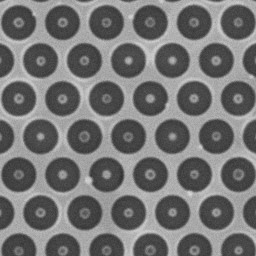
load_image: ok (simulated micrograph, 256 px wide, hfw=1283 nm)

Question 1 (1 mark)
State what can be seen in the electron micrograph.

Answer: an array of small figures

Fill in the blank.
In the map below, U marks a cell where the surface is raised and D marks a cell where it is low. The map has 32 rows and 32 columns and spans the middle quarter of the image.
UDDDDDDDDUUUDDDDDDDDUUUDDDDDDDDU
UDDDDDDDDUUUDDDDDDDDUUUDDDDDDDDU
UUDDDDDDUUUUUDDDDDDUUUUUDDDDDDUU
UUUDDDDUUUUUUUUDDUUUUUUUUUDDUUUU
DDUUUUUUUDDDUUUUUUUUDDDUUUUUUUDD
DDDUUUUDDDDDDDUUUUUDDDDDDUUUUDDD
DDDDUUDDDDDDDDDUUUDDDDDDDDUUUDDD
DDDDUUDDDDDDDDDUUDDDDDDDDDUUDDDD
DDDDUUDDDDUUDDDUUDDDDUDDDDUUDDDD
DDDDUUDDDDUDDDDUUDDDDDDDDDUUDDDD
DDDDUUDDDDDDDDDUUDDDDDDDDDUUUDDD
DDDUUUUDDDDDDDUUUUDDDDDDDUUUUDDD
DDUUUUUUDDDDDUUUUUUDDDDDUUUUUUDD
UUUUUUUUUUDUUUUUUUUUUUUUUUUUUUUU
UUUDDDDDUUUUUDDDDDDUUUUUUDDDDDUU
UUDDDDDDDUUUDDDDDDDDUUUDDDDDDDDU
UDDDDDDDDDUUDDDDDDDDUUUDDDDDDDDU
DDDDUUDDDDUUDDDUUDDDDUDDDDDDDDDD
DDDDUUDDDDUUDDDUUDDDDUDDDDDDDDDD
UDDDDDDDDUUUDDDDDDDDUUUDDDDDDDDU
UDDDDDDDDUUUDDDDDDDDUUUDDDDDDDDU
UUDDDDDDUUUUUDDDDDDUUUUUDDDDDDUU
UUUUDDUUUUUUUUUDDUUUUUUUUUDDUUUU
DUUUUUUUUDDDUUUUUUUUDDDUUUUUUUUD
DDDUUUUUDDDDDDUUUUUDDDDDDUUUUUDD
DDDDUUUDDDDDDDUUUUDDDDDDDDUUUDDD
DDDDUUDDDDDDDDDUUDDDDDDDDDUUDDDD
DDDDUUDDDDUDDDDUUDDDDUUDDDUUDDDD
DDDDUUUDDDDDDDDUUDDDDUDDDDUUDDDD
DDDDUUUDDDDDDDDUUUDDDDDDDDUUUDDD
DDDUUUUDDDDDDDUUUUDDDDDDDUUUUDDD
DDUUUUUUDDDDDUUUUUUDDDDDUUUUUUDD